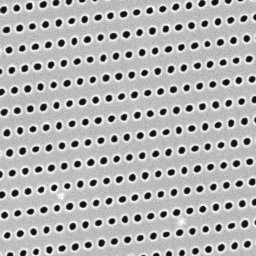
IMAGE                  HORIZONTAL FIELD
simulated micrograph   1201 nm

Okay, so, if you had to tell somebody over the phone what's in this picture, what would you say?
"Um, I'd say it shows a regular array of holes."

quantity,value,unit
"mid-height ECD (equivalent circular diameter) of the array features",0.0331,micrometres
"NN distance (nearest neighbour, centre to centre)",61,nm